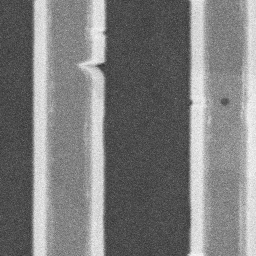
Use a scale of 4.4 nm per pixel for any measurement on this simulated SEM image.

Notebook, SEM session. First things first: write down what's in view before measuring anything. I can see one or a few lines or trenches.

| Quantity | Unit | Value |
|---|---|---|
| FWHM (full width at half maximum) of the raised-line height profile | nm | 252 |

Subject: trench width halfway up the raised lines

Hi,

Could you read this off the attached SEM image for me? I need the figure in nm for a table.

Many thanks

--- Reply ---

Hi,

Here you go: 435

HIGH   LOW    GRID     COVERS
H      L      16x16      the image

LLLHHHLLLLLLHHHH
LLLHHHLLLLLLHHHH
LLLHHHLLLLLLHHHH
LLLHHHLLLLLLHHHH
LLLHHHLLLLLLHHHH
LLLHHHLLLLLLHHHH
LLLHHHLLLLLLHHHH
LLLHHHLLLLLLHHHH
LLHHHHLLLLLLHHHH
LLHHHHLLLLLLHHHH
LLHHHHLLLLLLHHHH
LLHHHHLLLLLLHHHH
LLHHHHLLLLLLHHHH
LLHHHHLLLLLLHHHH
LLHHHHLLLLLLHHHH
LLHHHHLLLLLLHHHH